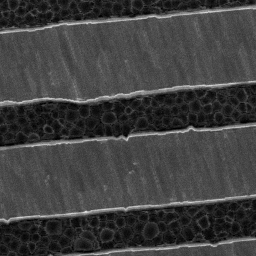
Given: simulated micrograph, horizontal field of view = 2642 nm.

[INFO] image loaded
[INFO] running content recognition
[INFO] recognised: one or a few lines or trenches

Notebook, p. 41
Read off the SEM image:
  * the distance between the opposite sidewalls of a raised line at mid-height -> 757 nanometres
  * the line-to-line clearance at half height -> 428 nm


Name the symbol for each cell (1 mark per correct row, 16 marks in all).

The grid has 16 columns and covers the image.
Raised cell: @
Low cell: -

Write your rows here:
---------------@
----@@@@@@@@@@@@
@@@@@@@@@@@@@@@@
@@@@@@@@@@@@@@@@
@@@@@@@@@@@@@@@@
@@@@@@@@@@@-----
----------------
----------------
--------@@@@@@@@
@@@@@@@@@@@@@@@@
@@@@@@@@@@@@@@@@
@@@@@@@@@@@@@@@@
@@@@@@@@@@@@@@--
@@@@------------
----------------
----------@@@@@@